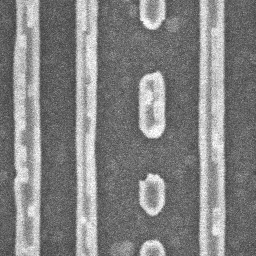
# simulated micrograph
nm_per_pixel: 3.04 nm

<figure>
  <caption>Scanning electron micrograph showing one or a few lines or trenches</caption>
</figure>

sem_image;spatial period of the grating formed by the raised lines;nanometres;188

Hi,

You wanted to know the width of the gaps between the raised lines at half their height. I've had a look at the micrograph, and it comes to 129 nm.